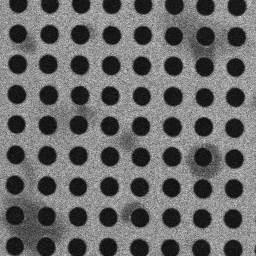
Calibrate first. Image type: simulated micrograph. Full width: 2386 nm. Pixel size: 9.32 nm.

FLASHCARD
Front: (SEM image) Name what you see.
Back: a regular array of holes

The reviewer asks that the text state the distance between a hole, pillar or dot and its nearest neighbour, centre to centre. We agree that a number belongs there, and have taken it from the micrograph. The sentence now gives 281 nm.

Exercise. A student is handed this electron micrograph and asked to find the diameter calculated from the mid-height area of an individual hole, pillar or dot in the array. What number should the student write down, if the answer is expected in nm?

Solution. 171